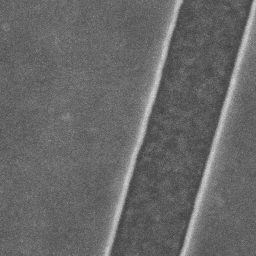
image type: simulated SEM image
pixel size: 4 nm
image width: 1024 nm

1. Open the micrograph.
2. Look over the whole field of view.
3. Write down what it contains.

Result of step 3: one or a few lines or trenches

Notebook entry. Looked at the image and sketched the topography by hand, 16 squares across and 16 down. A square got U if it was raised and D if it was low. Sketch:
UUUUUUUUUUUDDDDD
UUUUUUUUUUUDDDDD
UUUUUUUUUUUDDDDU
UUUUUUUUUUDDDDDU
UUUUUUUUUUDDDDDU
UUUUUUUUUUDDDDUU
UUUUUUUUUDDDDDUU
UUUUUUUUUDDDDDUU
UUUUUUUUUDDDDDUU
UUUUUUUUUDDDDUUU
UUUUUUUUDDDDDUUU
UUUUUUUUDDDDDUUU
UUUUUUUUDDDDUUUU
UUUUUUUDDDDDUUUU
UUUUUUUDDDDDUUUU
UUUUUUUDDDDDUUUU